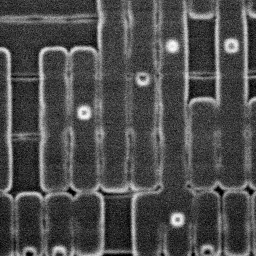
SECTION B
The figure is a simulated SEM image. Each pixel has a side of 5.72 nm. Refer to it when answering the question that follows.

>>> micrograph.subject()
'wiring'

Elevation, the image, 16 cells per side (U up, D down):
DDDDDDUUUUUUUUUU
DDDDDDUUUUUUDDUD
DDDDDDUUUUUUDDUD
UDUUUUUUUUUUDDUD
UDUUUUUUUUUUDDUD
UDDUUUUUUUUUDDUD
UDDUUUUUUUUUUUUU
UDDUUUUUUUUUUUUU
UDDUUUUUUUUUUUUU
UDDUUUUUUUUUUUUU
UDDUUUUUUUUUUUUU
UDDUUUUUUUUUUUUU
UUUUUUDDUUUUUUUU
UUUUUUDDUUUUUUUU
UUUUUUDDUUUUUUUU
UUUUUUDDUUUUUUUU